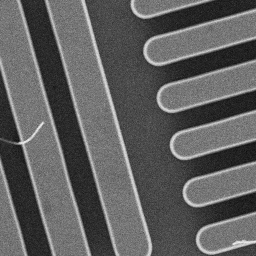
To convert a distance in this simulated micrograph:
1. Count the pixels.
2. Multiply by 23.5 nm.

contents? groups of lines, slits or small figures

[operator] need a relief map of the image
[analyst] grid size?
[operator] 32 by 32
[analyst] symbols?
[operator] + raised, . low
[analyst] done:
+++...+++++......++++++++.......
+++...+++++......++++..........+
+++...+++++................+++++
+++....++++............+++++++++
++++...+++++........++++++++++++
++++...+++++......++++++++++++..
++++....++++......++++++++......
+++++...++++.......+++..........
+++++...+++++...............++++
+++++...+++++............+++++++
.++++....++++........+++++++++++
.+++++...+++++......+++++++++++.
.+++++...+++++......+++++++.....
.+++++...+++++......++++........
..+++++...++++................++
..+++++...+++++...........++++++
..+++++...+++++.......++++++++++
..+++++...+++++......+++++++++++
...+++++...+++++.....+++++++....
...+++++...+++++......+++.......
...+++++...+++++...............+
....++++....++++...........+++++
+...+++++...+++++.......++++++++
+...+++++...+++++......+++++++++
+....++++...+++++......+++++++..
++...++++....++++.......++......
++...+++++...+++++..............
++...+++++...+++++..........++++
++....++++....++++.......+++++++
+++...+++++...+++++......+++++++
+++...+++++...+++++......++++++.
+++....++++...+++++.......+.....